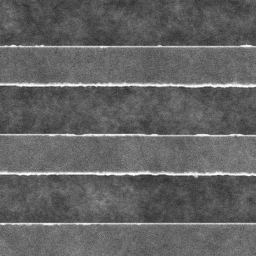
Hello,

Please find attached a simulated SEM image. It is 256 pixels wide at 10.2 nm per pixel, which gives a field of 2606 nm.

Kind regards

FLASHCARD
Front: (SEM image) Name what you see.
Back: lines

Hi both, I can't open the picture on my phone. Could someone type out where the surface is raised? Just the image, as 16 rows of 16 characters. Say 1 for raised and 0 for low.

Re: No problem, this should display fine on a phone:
0000000000000000
0000000000000000
0000000000000000
1111111111111111
1111111111111111
0000000000000000
0000000000000000
0000000000000000
1111111111111111
1111111111111111
1111111111111111
0000000000000000
0000000000000000
0000000000000000
1111111111111111
1111111111111111